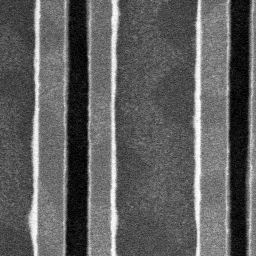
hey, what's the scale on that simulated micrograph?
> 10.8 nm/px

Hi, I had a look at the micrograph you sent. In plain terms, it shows lines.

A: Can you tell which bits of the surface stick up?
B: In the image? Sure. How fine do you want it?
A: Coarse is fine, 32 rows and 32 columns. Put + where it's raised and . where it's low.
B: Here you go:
.....+++...+++...........++++...
.....+++...+++...........++++...
.....+++...+++...........++++...
.....+++...+++...........++++..+
.....+++...+++...........++++...
.....+++...+++...........++++..+
.....+++...+++...........++++..+
.....+++...+++...........++++...
.....+++...+++...........+++...+
.....+++...+++...........+++...+
.....+++...+++...........++++..+
.....+++...+++...........++++..+
.....+++...+++...........+++...+
.....+++...+++...........+++...+
.....+++...+++...........++++..+
.....+++...+++...........+++...+
.....+++...+++...........+++...+
.....+++...+++...........+++...+
.....+++...+++...........++++..+
.....+++...+++...........++++..+
.....+++...+++...........+++...+
.....+++...+++...........+++...+
.....+++...+++...........+++...+
.....+++...+++...........+++...+
.....+++...+++...........+++...+
.....+++...+++...........+++...+
.....+++...+++...........+++...+
....++++...+++...........+++...+
....++++...+++...........+++...+
....++++...+++...........+++...+
.....+++...+++...........+++...+
.....+++...+++...........+++...+